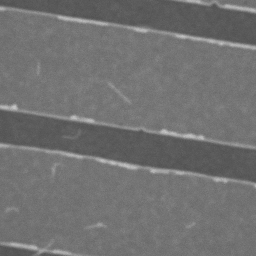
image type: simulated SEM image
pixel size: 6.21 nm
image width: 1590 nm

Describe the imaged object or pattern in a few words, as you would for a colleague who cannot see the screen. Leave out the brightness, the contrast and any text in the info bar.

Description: one or a few lines or trenches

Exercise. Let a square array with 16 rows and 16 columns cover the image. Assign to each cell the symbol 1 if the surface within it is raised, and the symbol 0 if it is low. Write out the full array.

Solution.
1000000000000011
1111111000000000
1111111111111000
1111111111111111
1111111111111111
1111111111111111
1111111111111111
0000011111111111
0000000000011111
1111000000000000
1111111110000000
1111111111111111
1111111111111111
1111111111111111
1111111111111111
0111111111111111